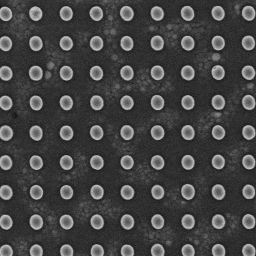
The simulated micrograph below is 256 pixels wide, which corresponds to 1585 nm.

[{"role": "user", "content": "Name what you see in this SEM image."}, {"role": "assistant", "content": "a regular array of raised bodies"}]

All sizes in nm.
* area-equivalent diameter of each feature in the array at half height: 85.5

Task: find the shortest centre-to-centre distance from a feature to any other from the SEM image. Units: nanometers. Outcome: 183